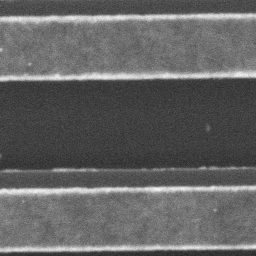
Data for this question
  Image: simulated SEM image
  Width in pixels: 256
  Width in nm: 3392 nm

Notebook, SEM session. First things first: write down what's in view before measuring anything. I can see lines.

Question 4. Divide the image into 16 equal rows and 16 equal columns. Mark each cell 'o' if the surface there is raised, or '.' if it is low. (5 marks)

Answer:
................
oooooooooooooooo
oooooooooooooooo
oooooooooooooooo
oooooooooooooooo
................
................
................
................
................
................
................
oooooooooooooooo
oooooooooooooooo
oooooooooooooooo
oooooooooooooooo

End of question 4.